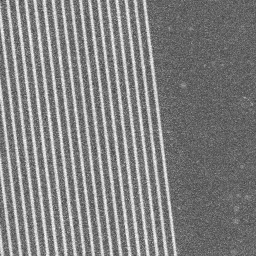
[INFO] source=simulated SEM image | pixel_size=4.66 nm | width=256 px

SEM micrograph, parallel lines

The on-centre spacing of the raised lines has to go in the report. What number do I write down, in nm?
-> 42.2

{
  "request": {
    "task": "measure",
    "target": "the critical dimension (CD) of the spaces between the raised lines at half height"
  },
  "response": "0.0341 microns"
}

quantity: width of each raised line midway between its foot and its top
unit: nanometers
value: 8.7